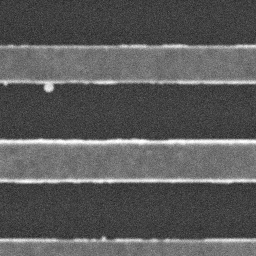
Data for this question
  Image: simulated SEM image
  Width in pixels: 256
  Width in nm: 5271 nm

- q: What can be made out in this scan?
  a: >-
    lines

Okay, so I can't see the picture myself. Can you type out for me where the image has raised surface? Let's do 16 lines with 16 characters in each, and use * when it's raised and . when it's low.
................
................
................
****************
****************
................
................
................
................
****************
****************
................
................
................
................
****************